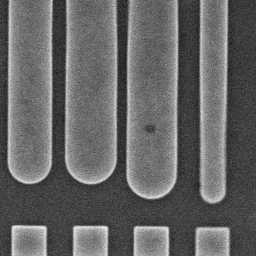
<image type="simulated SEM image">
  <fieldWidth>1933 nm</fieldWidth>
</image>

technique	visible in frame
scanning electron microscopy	groups of lines, slits or small figures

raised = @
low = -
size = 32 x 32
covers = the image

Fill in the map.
-@@@@@--@@@@@@--@@@@@@---@@@----
-@@@@@--@@@@@@--@@@@@@---@@@----
-@@@@@--@@@@@@--@@@@@@---@@@----
-@@@@@--@@@@@@@-@@@@@@---@@@----
-@@@@@--@@@@@@@-@@@@@@---@@@----
-@@@@@--@@@@@@@-@@@@@@---@@@----
-@@@@@--@@@@@@@-@@@@@@---@@@----
-@@@@@--@@@@@@@-@@@@@@---@@@----
-@@@@@--@@@@@@@-@@@@@@---@@@----
-@@@@@--@@@@@@@-@@@@@@---@@@----
-@@@@@--@@@@@@@-@@@@@@---@@@----
-@@@@@--@@@@@@@-@@@@@@---@@@----
-@@@@@--@@@@@@@-@@@@@@---@@@----
-@@@@@--@@@@@@--@@@@@@---@@@----
-@@@@@--@@@@@@--@@@@@@---@@@----
-@@@@@--@@@@@@@-@@@@@@---@@@----
-@@@@@--@@@@@@@-@@@@@@---@@@----
-@@@@@--@@@@@@@-@@@@@@---@@@----
-@@@@@--@@@@@@@-@@@@@@---@@@----
-@@@@@--@@@@@@--@@@@@@---@@@----
-@@@@@--@@@@@@--@@@@@@---@@@----
-@@@@@---@@@@@--@@@@@@---@@@----
--@@@-----@@@---@@@@@@---@@@----
----------------@@@@@----@@@----
-----------------@@@-----@@@----
--------------------------------
--------------------------------
--------------------------------
--@@@-----@@@----@@@@-----------
--@@@@---@@@@----@@@@----@@@@---
--@@@@---@@@@----@@@@----@@@@---
--@@@@---@@@@----@@@@---@@@@@---